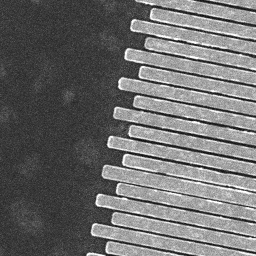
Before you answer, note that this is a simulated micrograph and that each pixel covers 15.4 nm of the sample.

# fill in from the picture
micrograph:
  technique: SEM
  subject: parallel lines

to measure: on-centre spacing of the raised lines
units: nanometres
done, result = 229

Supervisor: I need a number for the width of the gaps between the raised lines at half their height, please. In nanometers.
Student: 51.2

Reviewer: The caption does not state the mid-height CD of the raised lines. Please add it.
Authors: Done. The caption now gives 178 nm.